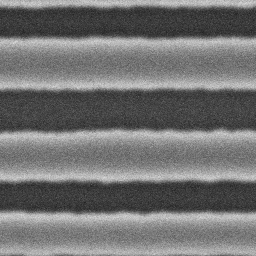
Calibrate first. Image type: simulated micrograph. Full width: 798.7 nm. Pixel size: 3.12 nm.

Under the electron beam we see lines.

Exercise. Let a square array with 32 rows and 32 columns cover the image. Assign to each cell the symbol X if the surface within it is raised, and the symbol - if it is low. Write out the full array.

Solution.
XXXXXXXXXXXXXXXXXXXXXXXXXXXXXXXX
--------------------------------
--------------------------------
--------------------------------
--------------------------------
XXXXXXXXXXXXXXXXXXXXXXXXXXXXXXXX
XXXXXXXXXXXXXXXXXXXXXXXXXXXXXXXX
XXXXXXXXXXXXXXXXXXXXXXXXXXXXXXXX
XXXXXXXXXXXXXXXXXXXXXXXXXXXXXXXX
XXXXXXXXXXXXXXXXXXXXXXXXXXXXXXXX
XXXXXXXXXXXXXXXXXXXXXXXXXXXXXXXX
--------------------------------
--------------------------------
--------------------------------
--------------------------------
--------------------------------
------------XXXXXXX--X-----X----
XXXXXXXXXXXXXXXXXXXXXXXXXXXXXXXX
XXXXXXXXXXXXXXXXXXXXXXXXXXXXXXXX
XXXXXXXXXXXXXXXXXXXXXXXXXXXXXXXX
XXXXXXXXXXXXXXXXXXXXXXXXXXXXXXXX
XXXXXXXXXXXXXXXXXXXXXXXXXXXXXXXX
-------------X------------------
--------------------------------
--------------------------------
--------------------------------
--------------------------------
XXXXXXXXXXXXXXXXXXXXXXXXXXXXXXXX
XXXXXXXXXXXXXXXXXXXXXXXXXXXXXXXX
XXXXXXXXXXXXXXXXXXXXXXXXXXXXXXXX
XXXXXXXXXXXXXXXXXXXXXXXXXXXXXXXX
XXXXXXXXXXXXXXXXXXXXXXXXXXXXXXXX